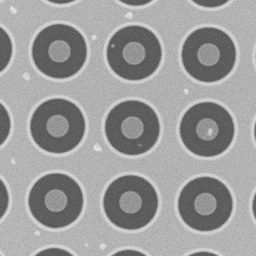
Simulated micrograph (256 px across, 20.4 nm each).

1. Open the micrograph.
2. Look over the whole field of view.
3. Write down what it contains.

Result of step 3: an array of small figures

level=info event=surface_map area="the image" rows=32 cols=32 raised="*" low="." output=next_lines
******...******....*****....****
********************************
********************************
*****.....*****....******..*****
.***......****......***......***
..**...*...**...*...***......***
..**..***..**..***..***..**...**
.***...*...**...**..***..**...**
.***......****......***......***
******...******....*****....****
********************************
********************************
******...*******..**************
.***......****.....****.....****
.***...*...**.......***......***
.***..**...**..***..**...**..***
.***..**...**..***..**...**..***
.***......***.......***......***
*****.....****.....****......***
****************.*******...*****
********************************
********************************
*****.....****.....*****....****
.***......***......****......***
.**...**...**..**...**...*...***
.**...**...**..***..**..***..**.
.***......***...*...**...*...**.
****......***......****......***
******..*******...******....****
********************************
********************************
*****....*****....******...*****